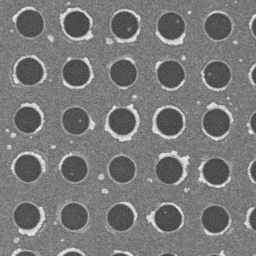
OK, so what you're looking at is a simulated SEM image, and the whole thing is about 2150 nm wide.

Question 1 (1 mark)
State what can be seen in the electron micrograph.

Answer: a regular array of holes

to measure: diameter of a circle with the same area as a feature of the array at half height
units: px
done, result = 27.8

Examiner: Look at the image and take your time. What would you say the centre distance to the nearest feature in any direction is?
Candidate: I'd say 46.8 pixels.